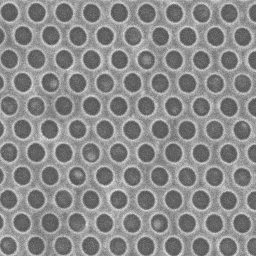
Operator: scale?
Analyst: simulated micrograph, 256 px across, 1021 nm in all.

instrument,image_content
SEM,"a regular array of holes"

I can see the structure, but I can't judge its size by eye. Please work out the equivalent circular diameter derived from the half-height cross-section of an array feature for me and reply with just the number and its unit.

76.2 nanometres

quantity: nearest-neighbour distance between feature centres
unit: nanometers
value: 107